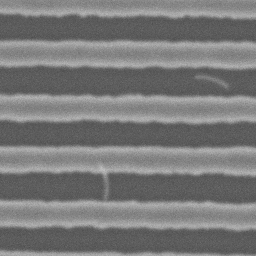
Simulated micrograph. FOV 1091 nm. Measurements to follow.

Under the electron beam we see lines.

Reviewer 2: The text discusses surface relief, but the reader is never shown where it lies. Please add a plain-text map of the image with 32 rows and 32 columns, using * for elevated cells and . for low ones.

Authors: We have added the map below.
********************************
********************************
................................
................................
................................
********************************
********************************
********************************
............................***.
................................
................................
................................
********************************
********************************
********************************
................................
................................
................................
*****.***************........**.
********************************
********************************
***...**...****.****************
................................
................................
................................
***************************.....
********************************
********************************
............*......*******..****
................................
................................
*...............................